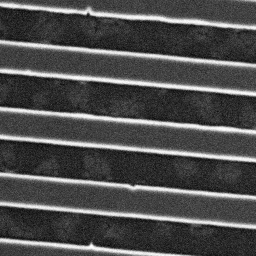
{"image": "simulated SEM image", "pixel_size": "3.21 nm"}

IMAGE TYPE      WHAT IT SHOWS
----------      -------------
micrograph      one or a few lines or trenches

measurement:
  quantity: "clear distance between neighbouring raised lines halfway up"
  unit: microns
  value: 0.115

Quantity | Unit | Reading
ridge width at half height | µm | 0.0967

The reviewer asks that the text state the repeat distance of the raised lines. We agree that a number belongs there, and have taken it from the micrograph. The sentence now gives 212 nanometers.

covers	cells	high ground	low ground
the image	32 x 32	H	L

HHHHHHHHHHHHHHHHHHHHHHHHHHHHHHHH
LLLLLLLLLLHHHHHHHHHHHHHHHHHHHHHH
LLLLLLLLLLLLLLLLLLLLLHHHHHHHHHHH
LLLLLLLLLLLLLLLLLLLLLLLLLLLLLLLH
LLLLLLLLLLLLLLLLLLLLLLLLLLLLLLLL
HHHLLLLLLLLLLLLLLLLLLLLLLLLLLLLL
HHHHHHHHHHHHHHHLLLLLLLLLLLLLLLLL
HHHHHHHHHHHHHHHHHHHHHHHHHLLLLLLL
HHHHHHHHHHHHHHHHHHHHHHHHHHHHHHHH
LLLLLLLHHHHHHHHHHHHHHHHHHHHHHHHH
LLLLLLLLLLLLLLLLLLHHHHHHHHHHHHHH
LLLLLLLLLLLLLLLLLLLLLLLLLLLLHHHH
LLLLLLLLLLLLLLLLLLLLLLLLLLLLLLLL
LLLLLLLLLLLLLLLLLLLLLLLLLLLLLLLL
HHHHHHHHHHHLLLLLLLLLLLLLLLLLLLLL
HHHHHHHHHHHHHHHHHHHHHHLLLLLLLLLL
HHHHHHHHHHHHHHHHHHHHHHHHHHHHHHHH
LLLLHHHHHHHHHHHHHHHHHHHHHHHHHHHH
LLLLLLLLLLLLLLLHHHHHHHHHHHHHHHHH
LLLLLLLLLLLLLLLLLLLLLLLLLHHHHHHH
LLLLLLLLLLLLLLLLLLLLLLLLLLLLLLLL
LLLLLLLLLLLLLLLLLLLLLLLLLLLLLLLL
HHHHHHHHHLLLLLLLLLLLLLLLLLLLLLLL
HHHHHHHHHHHHHHHHHHHLLLLLLLLLLLLL
HHHHHHHHHHHHHHHHHHHHHHHHHHHHHHLL
HHHHHHHHHHHHHHHHHHHHHHHHHHHHHHHH
LLLLLLLLLLHHHHHHHHHHHHHHHHHHHHHH
LLLLLLLLLLLLLLLLLLLLLHHHHHHHHHHH
LLLLLLLLLLLLLLLLLLLLLLLLLLLLLLLL
LLLLLLLLLLLLLLLLLLLLLLLLLLLLLLLL
HHHHHHHLLLLLLLLLLLLLLLLLLLLLLLLL
HHHHHHHHHHHHHHHHLLLLLLLLLLLLLLLL